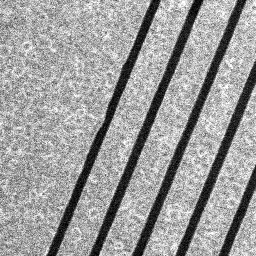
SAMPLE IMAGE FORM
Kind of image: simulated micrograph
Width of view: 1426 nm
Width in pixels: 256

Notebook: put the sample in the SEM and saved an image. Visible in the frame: parallel lines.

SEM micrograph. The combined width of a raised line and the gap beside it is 222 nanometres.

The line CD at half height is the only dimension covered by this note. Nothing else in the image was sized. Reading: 169 nanometres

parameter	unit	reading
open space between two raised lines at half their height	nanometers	52.8